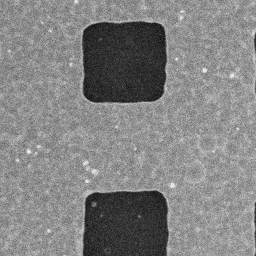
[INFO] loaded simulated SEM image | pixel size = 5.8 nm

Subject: holes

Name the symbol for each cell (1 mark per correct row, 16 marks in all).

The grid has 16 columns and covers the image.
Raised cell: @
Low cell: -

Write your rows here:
@@@@@@@@@@@@@@@@
@@@@@@----@@@@@@
@@@@@-----@@@@@@
@@@@@-----@@@@@@
@@@@@-----@@@@@@
@@@@@-----@@@@@@
@@@@@@@@@@@@@@@@
@@@@@@@@@@@@@@@@
@@@@@@@@@@@@@@@@
@@@@@@@@@@@@@@@@
@@@@@@@@@@@@@@@@
@@@@@@@@@@@@@@@@
@@@@@-----@@@@@@
@@@@@-----@@@@@@
@@@@@------@@@@@
@@@@@-----@@@@@@